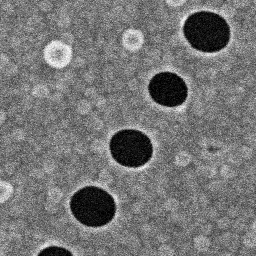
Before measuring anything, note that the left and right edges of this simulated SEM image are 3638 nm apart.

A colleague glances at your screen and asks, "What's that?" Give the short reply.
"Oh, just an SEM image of holes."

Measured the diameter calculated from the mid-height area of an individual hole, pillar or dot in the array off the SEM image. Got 608 nm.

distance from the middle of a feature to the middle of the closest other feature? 986 nanometres